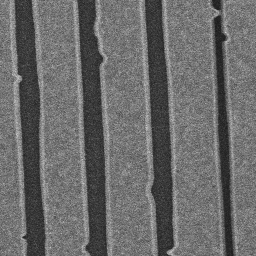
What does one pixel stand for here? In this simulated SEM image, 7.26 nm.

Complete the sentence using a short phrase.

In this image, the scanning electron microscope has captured one or a few lines or trenches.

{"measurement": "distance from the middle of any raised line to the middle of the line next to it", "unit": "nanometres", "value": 480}